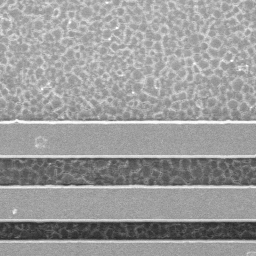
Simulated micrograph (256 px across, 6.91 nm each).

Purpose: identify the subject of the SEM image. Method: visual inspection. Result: one or a few lines or trenches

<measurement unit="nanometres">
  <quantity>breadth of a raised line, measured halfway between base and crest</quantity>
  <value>239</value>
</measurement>